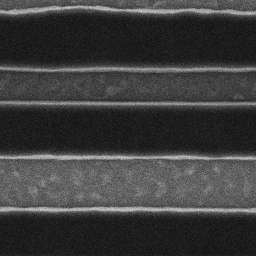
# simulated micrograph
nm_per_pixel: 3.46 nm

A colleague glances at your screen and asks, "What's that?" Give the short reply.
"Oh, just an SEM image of one or a few lines or trenches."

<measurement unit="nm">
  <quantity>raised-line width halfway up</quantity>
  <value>198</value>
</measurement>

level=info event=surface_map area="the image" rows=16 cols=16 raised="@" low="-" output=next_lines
---@@@@---------
@@@@@@@@@@@@@@@@
@@@@@@@@@@@@@@@@
@@@@@@@@@@@@@@@@
----------------
----------------
@@@@@@@@@@@@@@@@
@@@@@@@@@@@@@@@@
@@@@@@@@@@@@@@@@
@@@@@@@@@@@@@@@@
----------------
----------------
----------------
@@@@@@@@@@@@@@@@
@@@@@@@@@@@@@@@@
@@@@@@@@@@@@@@@@